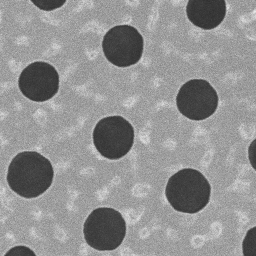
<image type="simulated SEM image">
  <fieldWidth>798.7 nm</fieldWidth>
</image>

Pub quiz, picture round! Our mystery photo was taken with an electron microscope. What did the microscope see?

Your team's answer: holes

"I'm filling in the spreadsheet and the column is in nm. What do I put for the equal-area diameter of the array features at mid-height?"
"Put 132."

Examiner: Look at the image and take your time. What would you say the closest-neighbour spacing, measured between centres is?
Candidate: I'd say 285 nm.